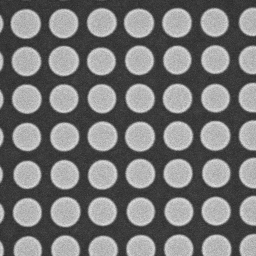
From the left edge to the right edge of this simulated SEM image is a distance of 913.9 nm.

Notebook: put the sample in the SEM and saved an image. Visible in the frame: an array of small figures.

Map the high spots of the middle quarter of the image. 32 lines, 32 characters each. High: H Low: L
HHHHLLHHHHHHHLLHHHHHHHLLLHHHHHHH
HHHLLLHHHHHHLLLLHHHHHHLLLLHHHHHL
HHLLLLLLHHHLLLLLLHHHLLLLLLLHHLLL
LLLLLLLLLLLLLLLLLLLLLLLLLLLLLLLL
LLLLLLLLLLLLLLLLLLLLLLLLLLLLLLLL
HHLLLLLHHHHLLLLLLHHHHLLLLLHHHHLL
HHHLLLHHHHHHLLLLHHHHHHLLLHHHHHHH
HHHLLLHHHHHHHLLHHHHHHHLLLHHHHHHH
HHHHLLHHHHHHHLLHHHHHHHHLLHHHHHHH
HHHHLLHHHHHHHLLHHHHHHHHLLHHHHHHH
HHHLLLHHHHHHHLLLHHHHHHLLLHHHHHHH
HHLLLLLHHHHHLLLLLHHHHLLLLLHHHHHL
LLLLLLLLLLLLLLLLLLLLLLLLLLLLLLLL
LLLLLLLLLLLLLLLLLLLLLLLLLLLLLLLL
LLLLLLLLLHHLLLLLLLHHLLLLLLLHHHLL
HHHLLLLHHHHHLLLLHHHHHHLLLLHHHHHL
HHHLLLHHHHHHHLLLHHHHHHLLLHHHHHHH
HHHHLLHHHHHHHLLHHHHHHHHLLHHHHHHH
HHHHLLHHHHHHHLLHHHHHHHHLLHHHHHHH
HHHHLLHHHHHHHLLHHHHHHHHLLHHHHHHH
HHHLLLLHHHHHHLLLHHHHHHLLLLHHHHHL
HHLLLLLLHHHLLLLLLHHHHLLLLLLLHLLL
LLLLLLLLLLLLLLLLLLLLLLLLLLLLLLLL
LLLLLLLLLLLLLLLLLLLLLLLLLLLLLLLL
HHLLLLLLHHHHLLLLLHHHHLLLLLHHHHHL
HHHLLLLHHHHHHLLLHHHHHHLLLHHHHHHH
HHHHLLHHHHHHHLLLHHHHHHHLLHHHHHHH
HHHHLLHHHHHHHLLHHHHHHHHLLHHHHHHH
HHHHLLHHHHHHHLLLHHHHHHHLLHHHHHHH
HHHLLLHHHHHHHLLLHHHHHHLLLHHHHHHL
HHHLLLLHHHHHLLLLLHHHHLLLLLLHHHHL
LLLLLLLLLLLLLLLLLLLLLLLLLLLLLLLL